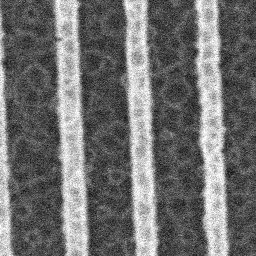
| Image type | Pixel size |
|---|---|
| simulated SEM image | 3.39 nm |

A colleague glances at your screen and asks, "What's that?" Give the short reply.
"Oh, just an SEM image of one or a few lines or trenches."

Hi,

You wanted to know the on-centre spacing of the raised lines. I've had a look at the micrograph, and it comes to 0.238 microns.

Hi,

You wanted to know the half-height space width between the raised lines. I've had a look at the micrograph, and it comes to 191 nm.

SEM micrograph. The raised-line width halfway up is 15.3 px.